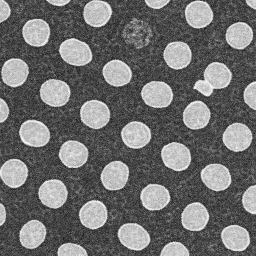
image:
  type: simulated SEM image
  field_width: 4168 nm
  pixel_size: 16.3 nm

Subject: a regular array of raised bodies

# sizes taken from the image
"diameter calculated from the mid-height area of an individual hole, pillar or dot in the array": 0.451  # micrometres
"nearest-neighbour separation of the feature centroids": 0.728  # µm